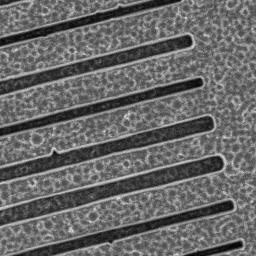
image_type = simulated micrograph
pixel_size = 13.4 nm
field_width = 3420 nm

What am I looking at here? parallel lines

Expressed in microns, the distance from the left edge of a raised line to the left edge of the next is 0.574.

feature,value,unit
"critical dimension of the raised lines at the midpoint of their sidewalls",400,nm